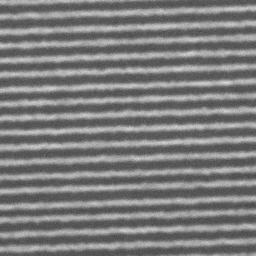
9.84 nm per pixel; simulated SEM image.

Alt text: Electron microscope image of parallel lines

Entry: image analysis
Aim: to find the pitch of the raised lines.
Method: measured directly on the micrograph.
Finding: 14.5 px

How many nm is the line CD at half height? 33.2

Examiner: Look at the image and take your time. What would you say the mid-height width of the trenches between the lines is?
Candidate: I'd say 107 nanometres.